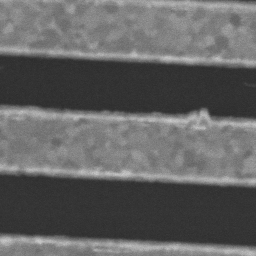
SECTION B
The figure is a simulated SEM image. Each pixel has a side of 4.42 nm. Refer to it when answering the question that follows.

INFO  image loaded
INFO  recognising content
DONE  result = one or a few lines or trenches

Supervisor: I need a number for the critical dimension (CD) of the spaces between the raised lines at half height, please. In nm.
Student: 290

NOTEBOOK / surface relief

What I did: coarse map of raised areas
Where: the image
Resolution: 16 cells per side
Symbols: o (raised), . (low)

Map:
oooooooooooooooo
oooooooooooooooo
oooooooooooooooo
.......ooooooooo
................
................
................
oooooooooo.oo...
oooooooooooooooo
oooooooooooooooo
oooooooooooooooo
................
................
................
................
oooooooooooo....